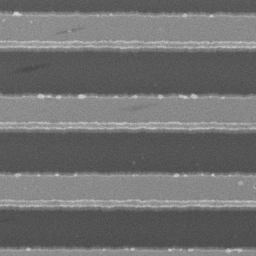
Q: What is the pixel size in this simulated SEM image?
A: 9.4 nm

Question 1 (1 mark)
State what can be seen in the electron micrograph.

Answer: lines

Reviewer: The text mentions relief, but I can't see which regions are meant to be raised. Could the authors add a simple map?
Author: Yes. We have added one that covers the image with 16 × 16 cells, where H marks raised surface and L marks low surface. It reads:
LLLLLLLLLLLLLLLL
HHHHHHHHHHHHHHHH
HHHHHHHHHHHHHHHH
LLLLLLLLLLLLLLLL
LLLLLLLLLLLLLLLL
LLLLLLLLLLLLLLLL
HHHHHHHHHHHHHHHH
HHHHHHHHHHHHHHHH
LLLLLLLLLLLLLLLL
LLLLLLLLLLLLLLLL
LLLLLLLLLLLLLLLL
HHHHHHHHHHHHHHHH
HHHHHHHHHHHHHHHH
LLLLLLLLLLLLLLLL
LLLLLLLLLLLLLLLL
LLLLLLLLLLLLLLLL